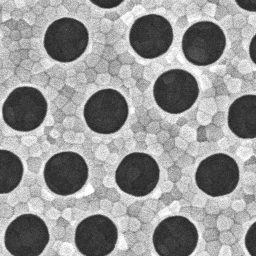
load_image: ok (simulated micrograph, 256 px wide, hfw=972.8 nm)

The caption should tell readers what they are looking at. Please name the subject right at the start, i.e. a regular array of holes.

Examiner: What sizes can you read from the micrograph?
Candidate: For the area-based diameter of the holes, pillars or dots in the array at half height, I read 44.6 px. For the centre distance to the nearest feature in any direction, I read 0.267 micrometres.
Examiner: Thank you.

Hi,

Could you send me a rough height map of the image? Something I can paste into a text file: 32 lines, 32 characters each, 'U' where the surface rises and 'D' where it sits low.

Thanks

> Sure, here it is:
UUUUUUUUUUUUDDDUUUUUUUUUUUUUUUDD
UUUUUUUUUUUUUUUUUUUUUUUUUUUUUUUU
UUUUUUUDDDUUUUUUUDDDDUUUUUUUUUUU
UUUUUUDDDDDUUUUUDDDDDDUUDDDDUUUU
UUUUUUDDDDDUUUUUDDDDDDUDDDDDUUUU
UUUUUDDDDDDUUUUUDDDDDUUDDDDDUUUD
UUUUUUDDDDUUUUUUUDDDDUUDDDDDUUUD
UUUUUUUDDUUUUUUUUUUUUUUDDDDUUUUD
UUUUUUUUUUUUUUUUUUUUUUUUUUUUUUUU
UUUUUUUUUUUUUUUUUUUUDDDDUUUUUUUU
UUUUUUUUUUUUUUUUUUUDDDDDDUUUUUUU
UDDDDUUUUUUUDDDUUUUDDDDDDUUUUUUU
UDDDDDUUUUUDDDDDUUUDDDDDDUUUUDDD
DDDDDDUUUUDDDDDDUUUUDDDDUUUUUDDD
DDDDDDUUUUDDDDDDUUUUUUUUUUUUUDDD
UDDDDUUUUUUDDDDUUUUUUUUUUUUUDDDD
UUUUUUUUUUUUDDUUUUUUUUUUUUUUUDDD
UUUUUUUUUUUUUUUUUUUUUUUUUUUUUUUU
UUUUUUUUUUUUUUUUUUUUUUUUUUUUUUUU
DDUUUUUDDDUUUUUUDDDUUUUUUUDDDUUU
DDDUUUDDDDDUUUUDDDDDUUUUUDDDDDUU
DDDUUDDDDDDUUUDDDDDDUUUUDDDDDDUU
DDDUUUDDDDDUUUDDDDDDUUUUDDDDDDUU
DDUUUUDDDDUUUUUDDDDUUUUUUDDDDUUU
UUUUUUUUUUUUUUUUUDUUUUUUUUDDUUUU
UUUUUUUUUUUUUUUUUUUUUUUUUUUUUUUU
UUUUUUUUUUUUUUUUUUUUUUUUUUUUUUUU
UUDDDUUUUUDDDDUUUUUUDDDDUUUUUUUU
UDDDDDUUUUDDDDDUUUUUDDDDUUUUUUUD
UDDDDDUUUDDDDDDUUUUDDDDDDUUUUUUD
UDDDDDUUUDDDDDUUUUUDDDDDDUUUUUUD
UDDDDUUUUUDDDDUUUUUUDDDDUUUUUUUD